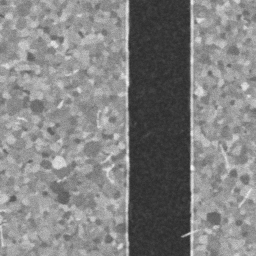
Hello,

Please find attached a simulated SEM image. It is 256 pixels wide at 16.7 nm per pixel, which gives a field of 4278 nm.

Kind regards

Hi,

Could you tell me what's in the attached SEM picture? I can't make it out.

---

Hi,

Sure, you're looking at one or a few lines or trenches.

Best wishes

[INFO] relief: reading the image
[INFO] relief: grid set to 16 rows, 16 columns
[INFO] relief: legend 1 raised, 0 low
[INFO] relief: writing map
1111111100001111
1111111100001111
1111111100001111
1111111100001111
1111111100001111
1111111100001111
1111111100001111
1111111100001111
1111111100001111
1111111100001111
1111111100001111
1111111100001111
1111111100001111
1111111100001111
1111111100001111
1111111100001111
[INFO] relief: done